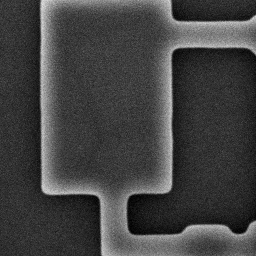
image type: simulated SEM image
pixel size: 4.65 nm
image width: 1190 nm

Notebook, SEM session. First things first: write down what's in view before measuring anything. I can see wiring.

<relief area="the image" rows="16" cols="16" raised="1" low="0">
0001111111100000
0001111111111111
0001111111111111
0001111111100000
0001111111100000
0001111111100000
0001111111100000
0001111111100000
0001111111100000
0001111111100000
0001111111100000
0001111111100000
0000001100000000
0000001100000000
0000001100011111
0000001111111111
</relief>